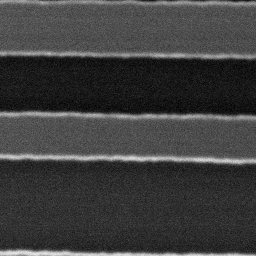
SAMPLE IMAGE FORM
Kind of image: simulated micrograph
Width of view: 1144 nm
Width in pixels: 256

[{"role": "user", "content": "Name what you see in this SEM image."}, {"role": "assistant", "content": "lines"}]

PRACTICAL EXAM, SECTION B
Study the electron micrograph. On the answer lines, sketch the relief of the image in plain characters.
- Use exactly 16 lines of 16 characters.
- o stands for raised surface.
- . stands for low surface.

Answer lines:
oooooooooooooooo
oooooooooooooooo
oooooooooooooooo
..........oooooo
................
................
................
oooooooooooooooo
oooooooooooooooo
oooooooooooooooo
................
................
................
................
................
................